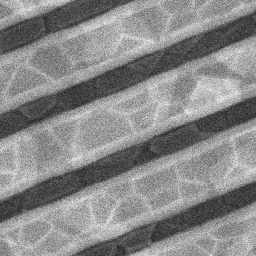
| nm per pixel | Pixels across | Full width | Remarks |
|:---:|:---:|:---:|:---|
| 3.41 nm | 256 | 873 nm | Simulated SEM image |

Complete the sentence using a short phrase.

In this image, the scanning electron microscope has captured one or a few lines or trenches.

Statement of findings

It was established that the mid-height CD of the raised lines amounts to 0.159 microns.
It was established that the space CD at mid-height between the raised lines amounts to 107 nm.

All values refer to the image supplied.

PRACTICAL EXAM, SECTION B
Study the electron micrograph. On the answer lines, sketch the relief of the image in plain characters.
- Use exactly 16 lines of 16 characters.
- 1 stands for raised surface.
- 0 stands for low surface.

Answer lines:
1110000011111111
0000001111111000
0001111111100000
0111111100000011
1111110000011111
1110000001111111
1000001111111100
0000111111100000
0111111110000011
1111110000001111
1111000001111111
1100000111111100
0000111111110000
0011111111000001
1111111000001111
1111100000111111